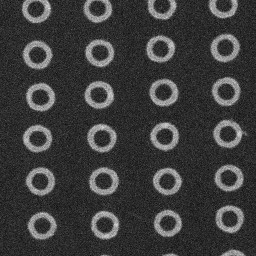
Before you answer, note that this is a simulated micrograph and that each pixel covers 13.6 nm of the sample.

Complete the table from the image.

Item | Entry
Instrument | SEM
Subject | a regular array of ring-shaped raised bodies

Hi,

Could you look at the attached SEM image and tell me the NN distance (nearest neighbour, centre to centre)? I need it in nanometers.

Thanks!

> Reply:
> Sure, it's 575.